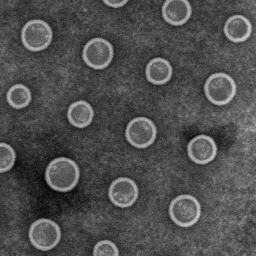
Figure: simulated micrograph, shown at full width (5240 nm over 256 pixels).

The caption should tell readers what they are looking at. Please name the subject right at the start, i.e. a regular array of raised bodies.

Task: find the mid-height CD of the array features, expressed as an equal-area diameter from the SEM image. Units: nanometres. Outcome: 578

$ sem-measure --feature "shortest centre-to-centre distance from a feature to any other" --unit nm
1290